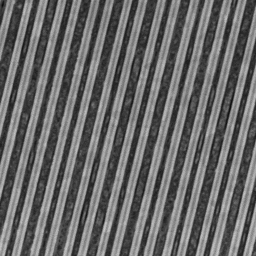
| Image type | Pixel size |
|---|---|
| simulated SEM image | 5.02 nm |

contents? parallel lines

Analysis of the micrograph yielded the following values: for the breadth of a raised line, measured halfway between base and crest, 29.9 nm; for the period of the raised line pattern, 0.0805 micrometres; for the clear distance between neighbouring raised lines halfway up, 42.7 nanometers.